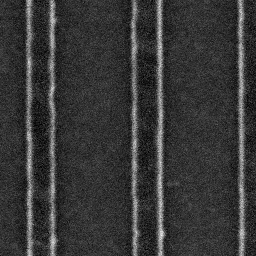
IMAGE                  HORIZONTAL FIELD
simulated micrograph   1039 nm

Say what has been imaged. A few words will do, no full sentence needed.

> one or a few lines or trenches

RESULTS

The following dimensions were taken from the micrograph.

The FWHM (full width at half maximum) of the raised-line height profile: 108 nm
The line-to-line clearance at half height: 323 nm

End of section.